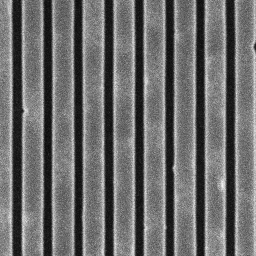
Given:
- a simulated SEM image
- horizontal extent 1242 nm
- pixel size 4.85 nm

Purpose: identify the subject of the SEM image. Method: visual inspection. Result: parallel lines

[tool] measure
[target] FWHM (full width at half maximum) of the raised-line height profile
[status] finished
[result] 0.0989 um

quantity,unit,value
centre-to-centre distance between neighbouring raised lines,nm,148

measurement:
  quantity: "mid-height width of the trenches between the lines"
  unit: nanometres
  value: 47.3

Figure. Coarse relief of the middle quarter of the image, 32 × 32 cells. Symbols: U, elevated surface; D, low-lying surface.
UUDDDUUUUUDDDUUUUUDDUUUUUDDDUUUU
UUDDDUUUUUDDDUUUUUDDUUUUUDDDUUUU
UUDDDUUUUUDDUUUUUUDDUUUUUDDDUUUU
UUDDDUUUUUDDUUUUUUDDUUUUUDDDUUUU
UUDDDUUUUUDDUUUUUUDDUUUUUDDDUUUU
UUDDDUUUUUDDUUUUUUDDUUUUUDDDUUUU
UUDDDUUUUUDDUUUUUUDDUUUUUDDDUUUU
UUDDDUUUUUDDUUUUUUDDUUUUUDDDUUUU
UUDDDUUUUUDDUUUUUUDDUUUUUDDDUUUU
UUDDDUUUUUDDUUUUUUDDUUUUUDDDUUUU
UUDDDUUUUUDDUUUUUUDDUUUUUDDDUUUU
UUDDDUUUUUDDUUUUUUDDUUUUUDDDUUUU
UUDDDUUUUUDDUUUUUUDDUUUUUDDDUUUU
UUDDDUUUUUDDUUUUUUDDUUUUUDDDUUUU
UUDDDUUUUUDDUUUUUUDDUUUUUDDDUUUU
UUDDDUUUUUDDUUUUUUDDUUUUUDDDUUUU
UUDDDUUUUUDDUUUUUUDDUUUUUDDDUUUU
UUDDDUUUUUDDUUUUUUDDUUUUUDDDUUUU
UUDDDUUUUUDDDUUUUUDDUUUUUDDDUUUU
UUDDDUUUUUDDDUUUUUDDUUUUUDDDUUUU
UUDDDUUUUUDDDUUUUUDDUUUUUDDDUUUU
UUDDDUUUUUDDDUUUUUDDUUUUUDDDUUUU
UUDDDUUUUUDDDUUUUUDDUUUUUDDDUUUU
UUUDDUUUUUDDDUUUUUDDUUUUUDDDUUUU
UUUDDUUUUUDDDUUUUUDDUUUUUDDDUUUU
UUUDDUUUUUDDDUUUUUDDUUUUUDDDUUUU
UUUDDUUUUUDDDUUUUUDDUUUUUDDUUUUU
UUUDDUUUUUDDDUUUUUDDUUUUUDDDUUUU
UUUDDUUUUUDDDUUUUUDDUUUUUDDDUUUU
UUUDDUUUUUDDDUUUUUDDUUUUUDDDUUUU
UUUDDUUUUUDDDUUUUUDDUUUUUDDDUUUU
UUDDDUUUUUDDDUUUUUDDUUUUUDDDUUUU